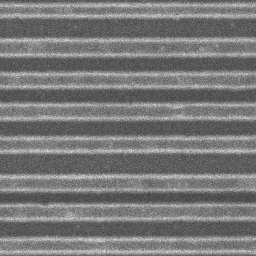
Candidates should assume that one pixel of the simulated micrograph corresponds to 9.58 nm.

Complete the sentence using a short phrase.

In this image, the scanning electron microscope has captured parallel lines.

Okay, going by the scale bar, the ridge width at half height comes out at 0.145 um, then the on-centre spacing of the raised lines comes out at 322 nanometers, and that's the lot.